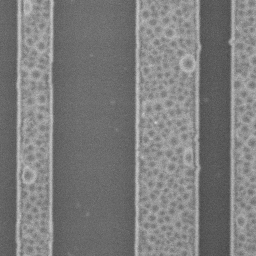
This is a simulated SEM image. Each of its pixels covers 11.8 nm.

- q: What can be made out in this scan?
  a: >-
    one or a few lines or trenches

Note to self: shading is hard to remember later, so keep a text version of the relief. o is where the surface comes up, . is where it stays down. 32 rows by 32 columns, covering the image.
..oooo...........oooooooo....ooo
..oooo...........oooooooo....ooo
..oooo...........oooooooo....ooo
..oooo...........oooooooo....ooo
..oooo...........oooooooo....ooo
..oooo...........oooooooo....ooo
..oooo...........oooooooo....ooo
..oooo...........oooooooo....ooo
..oooo...........oooooooo....ooo
..oooo...........oooooooo....ooo
..oooo...........oooooooo....ooo
..oooo...........oooooooo....ooo
..oooo...........oooooooo....ooo
..oooo...........oooooooo....ooo
..oooo...........oooooooo....ooo
..oooo...........oooooooo....ooo
..oooo...........oooooooo....ooo
..oooo...........oooooooo....ooo
..oooo...........oooooooo....ooo
..oooo...........oooooooo....ooo
..oooo...........oooooooo....ooo
..oooo...........oooooooo....ooo
..oooo...........oooooooo....ooo
..oooo...........oooooooo....ooo
..oooo...........oooooooo....ooo
..oooo...........oooooooo....ooo
..oooo...........oooooooo....ooo
..oooo...........oooooooo....ooo
..oooo...........oooooooo....ooo
..oooo...........oooooooo....ooo
..oooo...........oooooooo....ooo
..oooo...........oooooooo....ooo